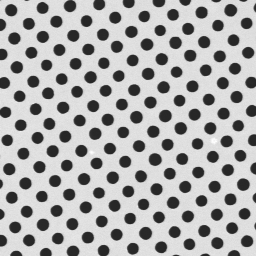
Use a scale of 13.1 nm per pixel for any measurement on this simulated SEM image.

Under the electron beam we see a regular array of holes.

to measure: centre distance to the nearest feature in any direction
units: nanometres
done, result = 257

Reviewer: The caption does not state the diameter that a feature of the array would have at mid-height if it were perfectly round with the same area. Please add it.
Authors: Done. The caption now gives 155 nm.